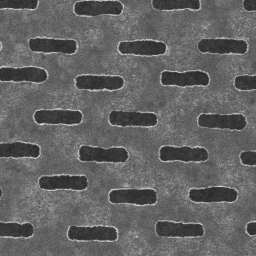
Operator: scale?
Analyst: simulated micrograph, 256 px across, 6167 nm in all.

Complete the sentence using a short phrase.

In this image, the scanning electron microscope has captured a regular array of holes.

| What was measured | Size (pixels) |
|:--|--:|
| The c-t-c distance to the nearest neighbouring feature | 50.1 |